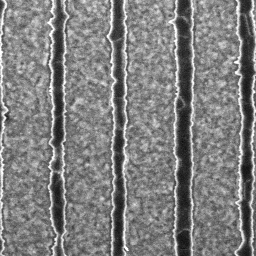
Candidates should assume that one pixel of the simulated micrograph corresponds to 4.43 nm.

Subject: one or a few lines or trenches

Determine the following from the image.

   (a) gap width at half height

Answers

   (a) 212 nm